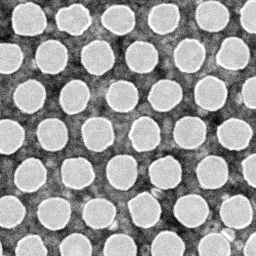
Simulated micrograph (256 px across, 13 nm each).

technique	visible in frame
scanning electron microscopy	a regular array of raised bodies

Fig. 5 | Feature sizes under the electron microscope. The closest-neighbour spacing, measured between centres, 43.7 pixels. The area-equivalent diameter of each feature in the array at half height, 413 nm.